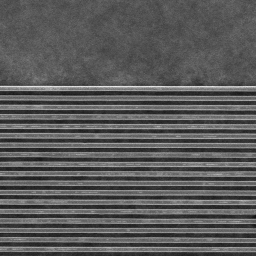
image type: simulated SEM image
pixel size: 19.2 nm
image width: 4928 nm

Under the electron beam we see parallel lines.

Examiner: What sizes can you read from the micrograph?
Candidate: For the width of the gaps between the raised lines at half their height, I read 101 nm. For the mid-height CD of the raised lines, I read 0.0842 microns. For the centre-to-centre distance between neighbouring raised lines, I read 0.182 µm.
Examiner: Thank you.